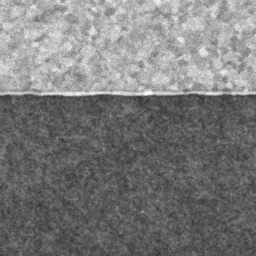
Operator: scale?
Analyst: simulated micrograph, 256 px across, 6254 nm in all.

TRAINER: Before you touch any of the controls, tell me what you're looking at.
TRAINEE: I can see one or a few lines or trenches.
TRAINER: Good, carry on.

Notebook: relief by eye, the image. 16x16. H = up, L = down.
HHHHHHHHHHHHHHHH
HHHHHHHHHHHHHHHH
HHHHHHHHHHHHHHHH
HHHHHHHHHHHHHHHH
HHHHHHHHHHHHHHHH
HHHHHHHHHHHHHHHH
LLLLLLLLLLLLLLLL
LLLLLLLLLLLLLLLL
LLLLLLLLLLLLLLLL
LLLLLLLLLLLLLLLL
LLLLLLLLLLLLLLLL
LLLLLLLLLLLLLLLL
LLLLLLLLLLLLLLLL
LLLLLLLLLLLLLLLL
LLLLLLLLLLLLLLLL
LLLLLLLLLLLLLLLL